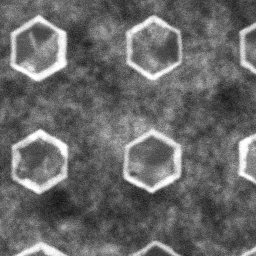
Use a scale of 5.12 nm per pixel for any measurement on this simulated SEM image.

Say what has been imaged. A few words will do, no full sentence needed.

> raised bodies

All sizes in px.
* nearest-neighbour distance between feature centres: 113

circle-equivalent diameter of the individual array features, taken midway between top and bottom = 284 nanometers